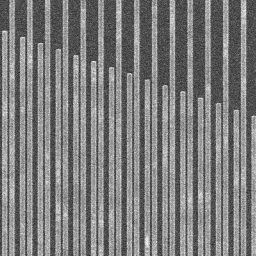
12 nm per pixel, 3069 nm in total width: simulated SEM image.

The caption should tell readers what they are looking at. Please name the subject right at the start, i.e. parallel lines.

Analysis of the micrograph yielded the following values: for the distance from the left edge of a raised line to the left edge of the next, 106 nanometres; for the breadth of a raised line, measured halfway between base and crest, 52.5 nm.